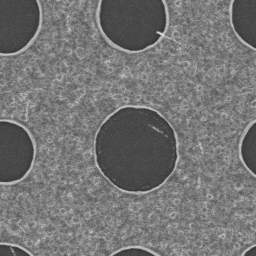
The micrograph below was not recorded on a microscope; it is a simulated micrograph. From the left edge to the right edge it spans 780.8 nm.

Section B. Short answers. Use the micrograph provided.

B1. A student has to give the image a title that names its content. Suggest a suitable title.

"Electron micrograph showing holes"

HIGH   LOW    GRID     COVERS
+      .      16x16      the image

..++++....++++..
..++++....+++++.
..+++++...+++++.
++++++++++++++++
++++++++++++++++
++++++++++++++++
++++++++++++++++
+++++++...++++++
..++++.....++++.
..++++.....++++.
..++++.....++++.
+++++++...++++++
++++++++++++++++
++++++++++++++++
++++++++++++++++
.+++++++.+++++++